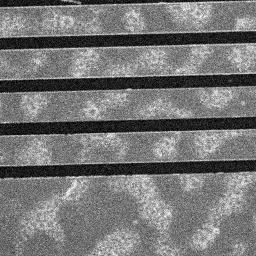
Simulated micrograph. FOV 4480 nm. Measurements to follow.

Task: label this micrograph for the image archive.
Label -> parallel lines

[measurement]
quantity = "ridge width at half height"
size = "518 nm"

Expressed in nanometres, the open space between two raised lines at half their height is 221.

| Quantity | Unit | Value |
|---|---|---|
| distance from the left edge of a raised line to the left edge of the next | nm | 751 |